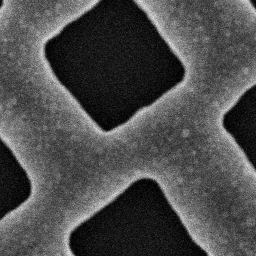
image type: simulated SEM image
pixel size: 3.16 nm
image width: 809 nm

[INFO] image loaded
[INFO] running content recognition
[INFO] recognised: holes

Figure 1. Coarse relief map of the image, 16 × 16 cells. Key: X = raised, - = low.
XXXXXX---XXXXXXX
XXXX------XXXXXX
XXX-------XXXXXX
XXX--------XXXXX
XXX---------XXXX
XXXX-------XXXXX
XXXXX-----XXXXX-
XXXXXX--XXXXXX--
XXXXXXXXXXXXXX--
-XXXXXXXXXXXXXX-
-XXXXXXXXXXXXXXX
--XXXXXX--XXXXXX
--XXXXX---XXXXXX
XXXXXX-----XXXXX
XXXX--------XXXX
XXXX---------XXX